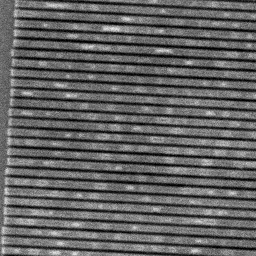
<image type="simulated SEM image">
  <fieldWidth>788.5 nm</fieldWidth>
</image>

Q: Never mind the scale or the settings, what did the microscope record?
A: parallel lines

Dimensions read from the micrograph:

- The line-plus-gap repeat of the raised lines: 30.6 nanometres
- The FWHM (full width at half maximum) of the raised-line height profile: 21.9 nm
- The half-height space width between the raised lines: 8.5 nanometers